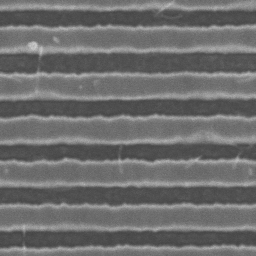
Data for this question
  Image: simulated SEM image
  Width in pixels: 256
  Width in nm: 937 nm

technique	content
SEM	lines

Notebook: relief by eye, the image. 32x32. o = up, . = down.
oooooooooooooooooooooooooooooooo
................................
................................
oooooooooooooooooooooooooooooooo
oooooooooooooooooooooooooooooooo
oooooooooooooooooooooooooooooooo
oooooooooooooo..ooo.oooo....o.o.
................................
................................
oooooooooooooooooooooooooooooooo
oooooooooooooooooooooooooooooooo
oooooooooooooooooooooooooooooooo
oooo...o.ooooo.ooo..............
................................
...oo.......o..o...oo......ooo..
oooooooooooooooooooooooooooooooo
oooooooooooooooooooooooooooooooo
oooooooooooooooooooooooooooooooo
................................
................................
oooooooooooooooooooooooooooooooo
oooooooooooooooooooooooooooooooo
oooooooooooooooooooooooooooooooo
.....o..........................
................................
..o..ooo..o...........oo........
oooooooooooooooooooooooooooooooo
oooooooooooooooooooooooooooooooo
oooooooooooooooooooooooooooooooo
................................
................................
oooooooooooooooooooooooooooooooo